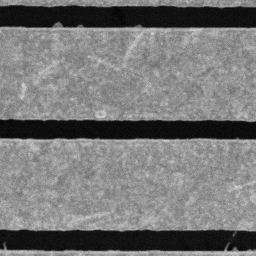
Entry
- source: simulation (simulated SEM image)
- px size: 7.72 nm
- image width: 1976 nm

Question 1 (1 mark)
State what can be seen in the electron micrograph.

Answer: lines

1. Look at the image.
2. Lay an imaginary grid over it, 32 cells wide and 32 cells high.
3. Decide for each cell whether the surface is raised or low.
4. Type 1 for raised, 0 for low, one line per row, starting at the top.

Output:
11111111111111111111111111111111
00000000000000000000000000000000
00000000000000000000000000000000
11100000000000000000000000000000
11111111111111111111111111111111
11111111111111111111111111111111
11111111111111111111111111111111
11111111111111111111111111111111
11111111111111111111111111111111
11111111111111111111111111111111
11111111111111111111111111111111
11111111111111111111111111111111
11111111111111111111111111111111
11111111111111111111111111111111
11111111111111111111111111111111
00000000000000000000000000000000
00000000000000000000000000000000
11111111111111111111111111111111
11111111111111111111111111111111
11111111111111111111111111111111
11111111111111111111111111111111
11111111111111111111111111111111
11111111111111111111111111111111
11111111111111111111111111111111
11111111111111111111111111111111
11111111111111111111111111111111
11111111111111111111111111111111
11111111111111111111111111111111
11111111111111111111111111111111
00000000000000000000000000000000
00000000000000000000000000000000
11111111111111111111111111111111